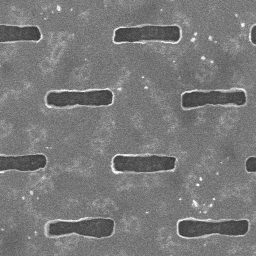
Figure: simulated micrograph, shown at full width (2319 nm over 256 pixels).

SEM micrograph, holes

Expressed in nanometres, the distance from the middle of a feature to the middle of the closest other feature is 829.